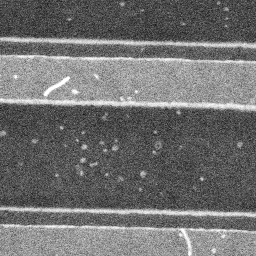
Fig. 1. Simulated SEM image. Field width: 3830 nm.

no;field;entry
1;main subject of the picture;lines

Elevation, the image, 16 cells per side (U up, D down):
DDDDDDDDDDDDDDDD
DDDDDDDDDDDDDDDD
DDDDDDDDDDDDDDDD
DDDDDDDDDDDDDDDD
UUUUUUUUUUUUUUUU
UUUUUUUUUUUUUUUU
DDDDDDDDDDDDUUUU
DDDDDDDDDDDDDDDD
DDDDDDDDDDDDDDDD
DDDDDDDDDDDDDDDD
DDDDDDDDDDDDDDDD
DDDDDDDDDDDDDDDD
DDDDDDDDDDDDDDDD
DDDDDDDDDDDDDDDD
UUUUUUUUUUUUUUUU
UUUUUUUUUUUUUUUU